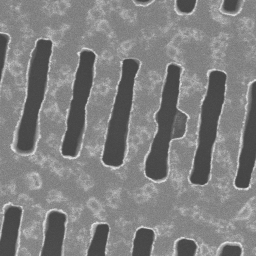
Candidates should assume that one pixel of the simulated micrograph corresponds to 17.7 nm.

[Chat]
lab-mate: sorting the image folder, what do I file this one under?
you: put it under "holes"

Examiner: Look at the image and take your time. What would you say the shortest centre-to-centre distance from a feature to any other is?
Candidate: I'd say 771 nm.